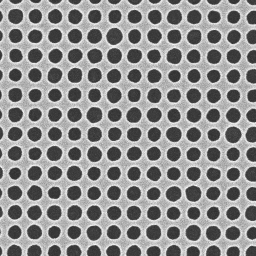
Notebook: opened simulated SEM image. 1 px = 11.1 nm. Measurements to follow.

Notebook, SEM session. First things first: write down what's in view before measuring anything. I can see a regular array of holes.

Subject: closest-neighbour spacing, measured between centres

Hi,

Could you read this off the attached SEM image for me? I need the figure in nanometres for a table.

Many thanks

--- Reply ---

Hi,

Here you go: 216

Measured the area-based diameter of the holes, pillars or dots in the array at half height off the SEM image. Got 162 nm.